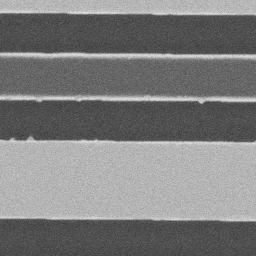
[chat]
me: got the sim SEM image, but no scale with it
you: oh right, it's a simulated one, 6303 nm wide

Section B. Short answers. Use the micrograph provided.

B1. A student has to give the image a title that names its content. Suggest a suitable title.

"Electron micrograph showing lines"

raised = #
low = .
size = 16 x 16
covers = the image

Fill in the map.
################
................
................
################
################
################
................
................
................
################
################
################
################
################
................
................